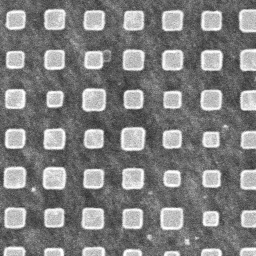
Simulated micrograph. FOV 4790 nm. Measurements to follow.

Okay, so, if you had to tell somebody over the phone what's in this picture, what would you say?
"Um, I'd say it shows a regular array of raised bodies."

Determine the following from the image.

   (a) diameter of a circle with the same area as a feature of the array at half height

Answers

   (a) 393 nanometres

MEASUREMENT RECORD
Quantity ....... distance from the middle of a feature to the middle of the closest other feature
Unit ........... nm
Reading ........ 730